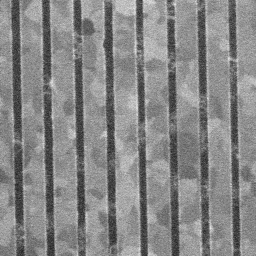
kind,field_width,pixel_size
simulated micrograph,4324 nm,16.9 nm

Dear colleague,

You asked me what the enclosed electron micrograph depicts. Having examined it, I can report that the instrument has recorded parallel lines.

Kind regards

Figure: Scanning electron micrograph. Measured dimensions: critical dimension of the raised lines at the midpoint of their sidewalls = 0.369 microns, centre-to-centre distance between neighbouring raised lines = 0.524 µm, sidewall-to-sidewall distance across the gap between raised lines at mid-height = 0.154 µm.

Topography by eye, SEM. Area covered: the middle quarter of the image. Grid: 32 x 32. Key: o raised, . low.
oo...ooooo...ooooo..oooooo..oooo
oo...ooooo...ooooo..oooooo..oooo
oo...ooooo...ooooo..oooooo..oooo
oo...ooooo...ooooo..oooooo..oooo
oo...ooooo...ooooo..oooooo..oooo
oo...ooooo...ooooo..oooooo..oooo
oo...ooooo...ooooo..oooooo..oooo
oo...ooooo...ooooo..oooooo..oooo
oo...ooooo...ooooo..oooooo..oooo
ooo..ooooo...ooooo..oooooo..oooo
ooo..ooooo...ooooo..oooooo..oooo
ooo..ooooo...ooooo...ooooo..oooo
ooo..ooooo...ooooo...ooooo..oooo
ooo..ooooo...ooooo...ooooo..oooo
ooo..ooooo...ooooo...ooooo..oooo
ooo..ooooo...ooooo...ooooo..oooo
ooo..ooooo...ooooo...ooooo..oooo
ooo..ooooo...ooooo...ooooo..oooo
ooo..ooooo...ooooo...ooooo..oooo
ooo..ooooo...ooooo...ooooo..oooo
ooo..oooooo..ooooo...ooooo..oooo
ooo..ooooo...ooooo...ooooo..oooo
ooo..ooooo...ooooo...ooooo...ooo
ooo..oooooo..ooooo...ooooo...ooo
ooo..oooooo..ooooo...ooooo...ooo
ooo..oooooo..oooooo..ooooo...ooo
ooo..oooooo..ooooo...ooooo...ooo
ooo..oooooo..ooooo...ooooo...ooo
ooo..oooooo..ooooo...ooooo...ooo
ooo..oooooo..ooooo...ooooo...ooo
ooo..oooooo..ooooo...ooooo...ooo
ooo..oooooo..ooooo...ooooo...ooo